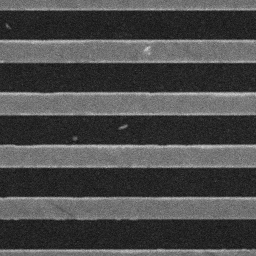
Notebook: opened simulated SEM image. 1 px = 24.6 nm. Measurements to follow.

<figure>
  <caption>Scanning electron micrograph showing lines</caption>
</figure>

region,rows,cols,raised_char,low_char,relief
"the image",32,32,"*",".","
********************************
................................
................................
................................
................................
********************************
********************************
********************************
................................
................................
................................
................................
********************************
********************************
................................
................................
................................
................................
********************************
********************************
********************************
................................
................................
................................
................................
********************************
********************************
................................
................................
................................
................................
********************************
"